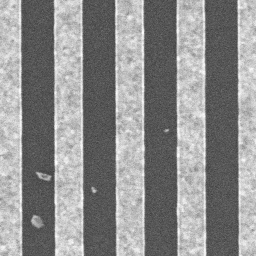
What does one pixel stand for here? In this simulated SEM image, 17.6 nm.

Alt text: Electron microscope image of wiring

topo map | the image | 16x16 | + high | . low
+..++..++..++..+
+..++..++..++..+
+..++..++..++..+
+..++..++..++..+
+..++..++..++..+
+..++..++..++..+
+..++..++..++..+
+..++..++..++..+
+..++..++..++..+
+..++..++..++..+
+..++..++..++..+
+..++..++..++..+
+..++..++..++..+
+..++..++..++..+
+..++..++..++..+
+...+..++..++..+